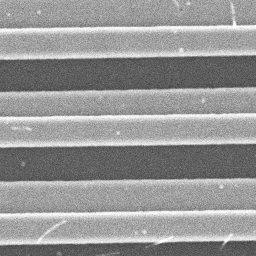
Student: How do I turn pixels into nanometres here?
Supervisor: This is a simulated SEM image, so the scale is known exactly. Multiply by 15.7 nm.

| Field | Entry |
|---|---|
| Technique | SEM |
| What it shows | lines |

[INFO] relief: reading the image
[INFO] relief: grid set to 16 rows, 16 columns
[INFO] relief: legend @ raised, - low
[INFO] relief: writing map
@@@@@@@@@@@@@@@@
@@@@@@@@@@@@@@@@
@@@@@@@@@@@@@@@@
@@@@@@@@@@@-----
----------------
---------------@
@@@@@@@@@@@@@@@@
@@@@@@@@@@@@@@@@
@@@@@@@@@@@@@@@@
----------------
----------------
@@@@@@@@@@@@@@@@
@@@@@@@@@@@@@@@@
@@@@@@@@@@@@@@@@
@@@@@@@@@@@@@@@@
----------------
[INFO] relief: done